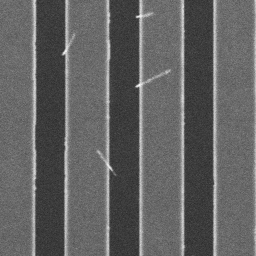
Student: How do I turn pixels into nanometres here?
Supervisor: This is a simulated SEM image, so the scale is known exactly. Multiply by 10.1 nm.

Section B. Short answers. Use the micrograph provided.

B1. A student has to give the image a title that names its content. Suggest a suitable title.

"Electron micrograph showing lines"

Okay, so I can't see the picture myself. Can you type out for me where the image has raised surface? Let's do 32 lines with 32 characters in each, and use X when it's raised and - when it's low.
XXXX----XXXXXX---XXXXXX----XXXXX
XXXX----XXXXXX---XXXXXX----XXXXX
XXXX----XXXXXX---XXXXXX----XXXXX
XXXX----XXXXXX---XXXXXX----XXXXX
XXXX----XXXXXX---XXXXXX----XXXXX
XXXX----XXXXXX---XXXXXX----XXXXX
XXXX----XXXXXX---XXXXXX----XXXXX
XXXX----XXXXXX---XXXXXX----XXXXX
XXXX----XXXXXX---XXXXXX----XXXXX
XXXX----XXXXXX---XXXXXX----XXXXX
XXXX----XXXXXX---XXXXXX----XXXXX
XXXX----XXXXXX---XXXXXX----XXXXX
XXXX----XXXXXX---XXXXXX----XXXXX
XXXX----XXXXXX---XXXXXX----XXXXX
XXXX----XXXXXX---XXXXXX----XXXXX
XXXX----XXXXXX---XXXXXX----XXXXX
XXXX----XXXXXX---XXXXXX----XXXXX
XXXX----XXXXXX---XXXXXX----XXXXX
XXXX----XXXXXX---XXXXXX----XXXXX
XXXX----XXXXXX---XXXXXX----XXXXX
XXXX----XXXXXX---XXXXXX----XXXXX
XXXX----XXXXXX---XXXXXX----XXXXX
XXXX----XXXXXX---XXXXXX----XXXXX
XXXX----XXXXXX---XXXXXX----XXXXX
XXXX----XXXXXX---XXXXXX----XXXXX
XXXX----XXXXXX---XXXXXX----XXXXX
XXXX----XXXXXX---XXXXXX----XXXXX
XXXX----XXXXXX---XXXXXX----XXXXX
XXXX----XXXXXX---XXXXXX----XXXXX
XXXX----XXXXXX---XXXXXX----XXXXX
XXXX----XXXXXX---XXXXXX----XXXXX
XXXX----XXXXXX---XXXXXX----XXXXX